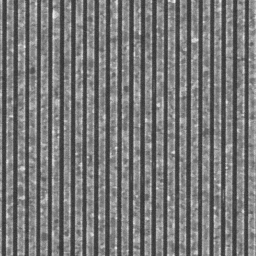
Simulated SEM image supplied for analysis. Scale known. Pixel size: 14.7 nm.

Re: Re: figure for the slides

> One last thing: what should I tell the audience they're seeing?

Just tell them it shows parallel lines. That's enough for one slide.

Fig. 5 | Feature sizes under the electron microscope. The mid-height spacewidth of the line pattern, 0.0827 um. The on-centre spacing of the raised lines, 170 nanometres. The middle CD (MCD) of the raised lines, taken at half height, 95.6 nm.